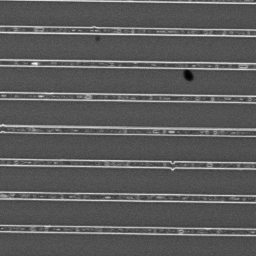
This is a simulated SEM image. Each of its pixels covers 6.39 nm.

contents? parallel lines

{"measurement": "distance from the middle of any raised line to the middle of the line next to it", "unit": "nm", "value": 212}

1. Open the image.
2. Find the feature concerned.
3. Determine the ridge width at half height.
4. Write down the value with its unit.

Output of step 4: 43.1 nanometers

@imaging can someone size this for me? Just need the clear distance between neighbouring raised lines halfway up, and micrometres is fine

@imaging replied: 0.166